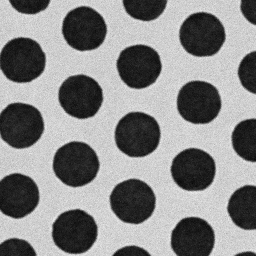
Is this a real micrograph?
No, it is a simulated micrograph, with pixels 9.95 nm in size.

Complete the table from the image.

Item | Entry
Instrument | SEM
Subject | a regular array of holes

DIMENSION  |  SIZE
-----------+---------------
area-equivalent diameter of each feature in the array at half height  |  45.5 pixels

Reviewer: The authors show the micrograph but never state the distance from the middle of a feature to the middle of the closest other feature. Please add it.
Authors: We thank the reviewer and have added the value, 0.655 um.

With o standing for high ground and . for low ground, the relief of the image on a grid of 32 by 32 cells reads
o.....ooooooooo......ooooooooo..
oo...oooo...oooo....oooooooooo..
oooooooo.....oooo..oooo....oooo.
oooooooo.....ooooooooo......oooo
oooooooo.....ooooooooo......oooo
o....oooo....oooooooooo.....oooo
.....oooooooooo.....ooo....oooo.
......ooooooooo.....oooooooooo..
......ooooooooo.....oooooooooo..
o....oooo..oooo.....oooooooooo..
oooooooo....oooo...oooo...oooo..
ooooooo......ooooooooo.....oooo.
ooooooo......ooooooooo......oooo
o....ooo.....ooooooooo......oooo
.....oooo...oooo...oooo....ooooo
.....oooooooooo.....oooo.ooooo..
.....ooooooooo......ooooooooo...
.....ooooooooo......ooooooooo...
oo.oooo....oooo.....oooo.oooo...
ooooooo.....oooo..oooo....oooo..
ooooooo.....ooooooooo......ooooo
ooooooo.....ooooooooo......ooooo
....ooo.....oooo..oooo.....ooooo
.....ooooooooo.....oooo...oooo..
.....ooooooooo.....oooooooooo...
.....ooooooooo......oooooooo....
....oooo...ooo.....ooooooooo....
ooooooo.....ooo...ooooo...ooo...
ooooooo.....oooooooooo.....ooo..
ooooooo.....ooooooooo......ooooo
....ooo.....ooooooooo......ooooo
....oooo...ooo....oooo....oooo..